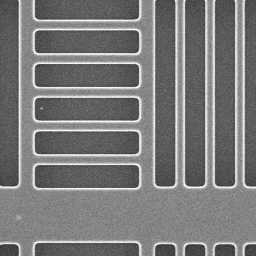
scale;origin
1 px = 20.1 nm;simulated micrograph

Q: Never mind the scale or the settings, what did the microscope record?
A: groups of lines, slits or small figures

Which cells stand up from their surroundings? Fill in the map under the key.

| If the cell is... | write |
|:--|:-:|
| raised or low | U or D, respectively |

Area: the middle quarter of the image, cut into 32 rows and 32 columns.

DDDDDDDDDDDDDDDDDDDUUUUDDDDDUUDD
DDDDDDDDDDDDDDDDDDDUUUUDDDDDUUDD
DDDDDDDDDDDDDDDDDDDUUUUDDDDDUUDD
DDDDDDDDDDDDDDDDDDDUUUUDDDDDUUDD
DDDDDDDDDDDDDDDDDDDUUUUDDDDDUUDD
DDDDDDDDDDDDDDDDDDUUUUUDDDDDUUDD
UUUUUUUUUUUUUUUUUUUUUUUDDDDDUUDD
UUUUUUUUUUUUUUUUUUUUUUUDDDDDUUDD
DDDDDDDDDDDDDDDDDDUUUUUDDDDDUUDD
DDDDDDDDDDDDDDDDDDDUUUUDDDDDUUDD
DDDDDDDDDDDDDDDDDDDUUUUDDDDDUUDD
DDDDDDDDDDDDDDDDDDDUUUUDDDDDUUDD
DDDDDDDDDDDDDDDDDDDUUUUDDDDDUUDD
DDDDDDDDDDDDDDDDDDDUUUUDDDDDUUDD
UUUUUUUUUUUUUUUUUUUUUUUDDDDDUUDD
UUUUUUUUUUUUUUUUUUUUUUUDDDDDUUDD
UUUUUUUUUUUUUUUUUUUUUUUDDDDDUUDD
DDDDDDDDDDDDDDDDDDDUUUUDDDDDUUDD
DDDDDDDDDDDDDDDDDDDUUUUDDDDDUUDD
DDDDDDDDDDDDDDDDDDDUUUUDDDDDUUDD
DDDDDDDDDDDDDDDDDDDUUUUDDDDDUUDD
DDDDDDDDDDDDDDDDDDDUUUUDDDDDUUDD
DDDDDDDDDDDDDDDDDDUUUUUDDDDDUUDD
UUUUUUUUUUUUUUUUUUUUUUUDDDDDUUDD
UUUUUUUUUUUUUUUUUUUUUUUDDDDDUUDD
DDDDDDDDDDDDDDDDDDUUUUUDDDDDUUDD
DDDDDDDDDDDDDDDDDDDUUUUDDDDDUUDD
DDDDDDDDDDDDDDDDDDDUUUUDDDDDUUDD
DDDDDDDDDDDDDDDDDDDUUUUDDDDDUUDD
DDDDDDDDDDDDDDDDDDDUUUUDDDDDUUDD
DDDDDDDDDDDDDDDDDDDUUUUDDDDDUUDD
UUUUUUUUUUUUUUUUUUUUUUUUUUUUUUUU